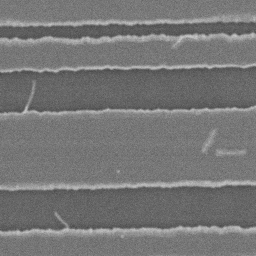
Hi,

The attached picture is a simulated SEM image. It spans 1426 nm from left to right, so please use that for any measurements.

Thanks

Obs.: lines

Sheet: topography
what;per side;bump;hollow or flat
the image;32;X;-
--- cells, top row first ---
XXXXXXXXXXXXXXXXXXXXXXXXXXXXXXXX
XXXXXXXXXXXXXXXXXXXXXXXXXXXXXXXX
XXXXXXXXXXXXXXXXXXXXXXXXXXX-----
--------------------------------
-----------------------X--XX---X
XXXXXXXXXXXXXXXXXXXXXXXXXXXXXXXX
XXXXXXXXXXXXXXXXXXXXXXXXXXXXXXXX
XXXXXXXXXXXXXXXXXXXXXXXXXXXXXXXX
XXXXXXXXXXXXXX-XX-XX------------
--------------------------------
--------------------------------
--------------------------------
--------------------------------
-------------------------------X
XXXXXXXXXXXXXXXXXXXXXXXXXXXXXXXX
XXXXXXXXXXXXXXXXXXXXXXXXXXXXXXXX
XXXXXXXXXXXXXXXXXXXXXXXXXXXXXXXX
XXXXXXXXXXXXXXXXXXXXXXXXXXXXXXXX
XXXXXXXXXXXXXXXXXXXXXXXXXXXXXXXX
XXXXXXXXXXXXXXXXXXXXXXXXXXXXXXXX
XXXXXXXXXXXXXXXXXXXXXXXXXXXXXXXX
XXXXXXXXXXXXXXXXXXXXXXXXXXXXXXXX
XXXXXXXXXXXXXXXXXXXXXXXXXXXXXXXX
-X------------------------------
--------------------------------
--------------------------------
--------------------------------
--------------------------------
----------------------------XX--
XXXXXXXXXXXXXXXXXXXXXXXXXXXXXXXX
XXXXXXXXXXXXXXXXXXXXXXXXXXXXXXXX
XXXXXXXXXXXXXXXXXXXXXXXXXXXXXXXX